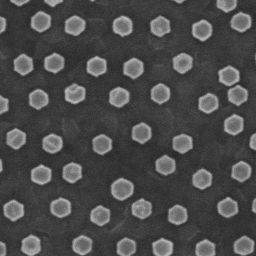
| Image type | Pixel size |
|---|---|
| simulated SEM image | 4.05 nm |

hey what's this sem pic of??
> a regular array of raised bodies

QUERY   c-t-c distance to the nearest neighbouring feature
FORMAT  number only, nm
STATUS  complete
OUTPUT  143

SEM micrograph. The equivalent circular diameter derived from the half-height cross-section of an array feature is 76.2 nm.